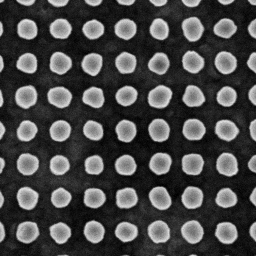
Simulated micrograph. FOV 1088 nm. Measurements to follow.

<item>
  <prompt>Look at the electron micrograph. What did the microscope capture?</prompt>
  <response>a regular array of raised bodies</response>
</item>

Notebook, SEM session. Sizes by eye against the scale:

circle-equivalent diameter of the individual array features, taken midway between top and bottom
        89.7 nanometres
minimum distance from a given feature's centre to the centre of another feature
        139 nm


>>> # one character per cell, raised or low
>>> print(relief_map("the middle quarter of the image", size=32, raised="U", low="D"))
UUDDUUUUUDDDDUUUUUDDDUUUUUDDDDUU
UDDDDUUUUDDDDDUUUUDDDDUUUUDDDDUU
DDDDDDUUDDDDDDDDDDDDDDDDDDDDDDDD
DDDDDDDDDDDDDDDDDDDDDDDDDDDDDDDD
DDDDDDDDDDDDDDDDDDDDDDDDDDDDDDDD
DDDDDDDDDDDDDDDUUDDDDDDUUDDDDDDU
UDDDDDUUUDDDDDUUUUDDDDUUUUUDDDDU
UUDDDUUUUUDDDUUUUUDDDUUUUUUDDDUU
UUDDDUUUUUDDDUUUUUDDDUUUUUUDDDUU
UUDDDUUUUUDDDUUUUUDDDUUUUUDDDDUU
UDDDDDDUUDDDDDDUDDDDDDUUUUDDDDDU
DDDDDDDDDDDDDDDDDDDDDDDDDDDDDDDD
DDDDDDDDDDDDDDDDDDDDDDDDDDDDDDDD
DDDDDDDDDDDDDDDDDDDDDDDDDDDDDDDD
UDDDDDUUDDDDDDUUUDDDDDUUUDDDDDUU
UUDDDUUUUDDDDUUUUUDDDUUUUUDDDDUU
UUDDDUUUUUDDDUUUUUDDDUUUUUDDDDUU
UDDDDUUUUUDDDUUUUUDDDUUUUUDDDDUU
UDDDDDUUUDDDDDUUUDDDDDUUUUDDDDDU
DDDDDDDDDDDDDDDDDDDDDDDDDDDDDDDD
DDDDDDDDDDDDDDDDDDDDDDDDDDDDDDDD
DDDDDDDDDDDDDDDDDDDDDDDDDDDDDDDD
DDDDDDDDDDDDDDDDDDDDDDDUUDDDDDDD
DDDDDDUUUDDDDDUUUDDDDDUUUUUDDDUU
UDDDDDUUUUDDDUUUUUDDDUUUUUUDDUUU
UDDDDDUUUUDDDUUUUUDDDDUUUUUDDDUU
UDDDDDUUUUDDDUUUUUDDDDUUUUDDDDUU
DDDDDDDDDDDDDDUUUDDDDDDDDDDDDDDU
DDDDDDDDDDDDDDDDDDDDDDDDDDDDDDDD
DDDDDDDDDDDDDDDDDDDDDDDDDDDDDDDD
DDDDDDDDDDDDDDDDDDDDDDDDDDDDDDDD
DDDDDDUUUDDDDDDUUDDDDDUUUDDDDDUU